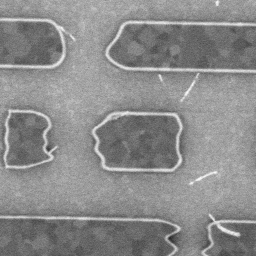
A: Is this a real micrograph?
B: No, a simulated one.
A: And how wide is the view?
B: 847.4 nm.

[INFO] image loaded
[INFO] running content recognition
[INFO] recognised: one or a few lines or trenches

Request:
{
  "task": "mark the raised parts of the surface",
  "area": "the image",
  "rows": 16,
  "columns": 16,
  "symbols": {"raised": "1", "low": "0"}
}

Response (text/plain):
0000000000000000
1110000011111100
1111000111111111
1111000111111111
0000000000000000
0000000000000000
0000000000000000
1110000111100000
1110001111100000
1110001111100000
0000000111100000
0000000000000000
0000000000000000
0000000000000000
1111111111100111
1111111111100111